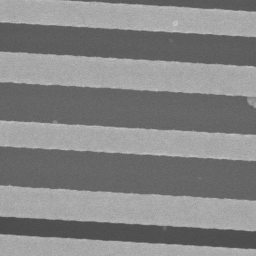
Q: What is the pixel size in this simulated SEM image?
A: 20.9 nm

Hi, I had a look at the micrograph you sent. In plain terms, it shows lines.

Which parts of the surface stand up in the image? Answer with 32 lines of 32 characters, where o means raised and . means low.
oooooooooooooo..................
ooooooooooooooooooooooooooooooo.
oooooooooooooooooooooooooooooooo
............oooooooooooooooooooo
..............................oo
................................
................................
ooooooooooooooooo...............
oooooooooooooooooooooooooooooooo
oooooooooooooooooooooooooooooooo
.....ooooooooooooooooooooooooooo
.......................ooooooooo
................................
................................
................................
ooooooo.........................
ooooooooooooooooooooooooo.......
oooooooooooooooooooooooooooooooo
.....ooooooooooooooooooooooooooo
......................oooooooooo
................................
................................
................................
oooo............................
oooooooooooooooooooooo..........
oooooooooooooooooooooooooooooooo
oooooooooooooooooooooooooooooooo
.........ooooooooooooooooooooooo
...........................ooooo
oo..............................
ooooooooooooooooooo.............
oooooooooooooooooooooooooooooooo